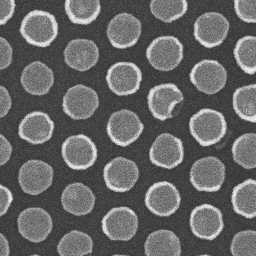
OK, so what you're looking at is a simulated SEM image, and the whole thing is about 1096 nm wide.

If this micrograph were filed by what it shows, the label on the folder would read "a regular array of raised bodies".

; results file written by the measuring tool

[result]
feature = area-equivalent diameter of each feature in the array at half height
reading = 0.149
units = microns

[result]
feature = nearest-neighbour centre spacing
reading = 0.202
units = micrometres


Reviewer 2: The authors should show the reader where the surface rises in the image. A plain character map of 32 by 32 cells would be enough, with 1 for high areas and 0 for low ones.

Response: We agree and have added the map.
11000000111100000001111000000111
11001100111100000001111000000011
10011110011100111000110001110011
00011110000001111100000011111000
00011110000001111000000011110000
10001100011100111001111001100011
10000000111100000011111000000111
10000000111100000001111000000011
10011100011000111001110011110011
00011110000001111100000011110000
00011110000000111000110011110000
10001100111100111001111001100111
10000000111100000011111000000111
10000000111100000001110000000111
00011100011000111001100011110011
00011110000001111100000011110000
00111110000001111100000011110000
10011100111000111001110001100011
10000000111100000001111000000111
10000000111100000001111000000111
00011100111101111001110011110011
00111110000001111000000011110000
00111110000001111000000011110001
10011100111000110001110011100111
10000000111100000011110000000111
10000000111100000011110000000111
10011100011000111001110011110011
00111100000001111000000011110000
00111100000001111000000011110000
00011100111001111001110001100111
10000001111100000011110000000111
10000001111000000011111000000111